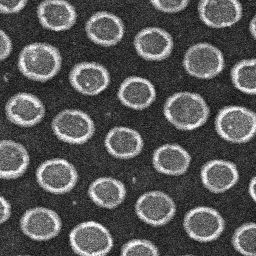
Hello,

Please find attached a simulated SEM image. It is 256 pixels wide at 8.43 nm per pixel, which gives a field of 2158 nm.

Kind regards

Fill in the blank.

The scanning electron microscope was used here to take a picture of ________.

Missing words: a regular array of raised bodies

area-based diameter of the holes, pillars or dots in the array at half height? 0.283 microns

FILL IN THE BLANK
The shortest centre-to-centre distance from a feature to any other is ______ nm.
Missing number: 427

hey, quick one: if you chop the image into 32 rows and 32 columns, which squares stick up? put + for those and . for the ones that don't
+++...++...........++++..+++++..
.....++++................+++++..
.....++++..++++..........+++++..
......++...++++................+
+..........++++..++++...........
+................++++...........
+..++++..........++++...+++.....
...++++................+++++....
...++++..++++..........+++++.+++
....++...++++............+...+++
.........++++..++++..........+++
..........++...++++............+
..+++..........++++..++++.......
.++++................+++++...+..
.++++..++++..........+++++.+++++
..++...++++...........+++..+++++
.......++++...+++..........+++++
........+++..+++++...........++.
++............++++..++..........
+++............+...++++.........
+++...+++..........++++...+++...
++...++++...........+++..++++...
.....++++...++...........+++++..
......+++...+++...........++...+
...........++++...+++...........
+............++..+++++..........
+...++...........+++++..+++.....
...++++...........+++..+++++....
...++++...+++..........+++++..++
....+++..+++++..........+++..+++
.........+++++..+++..........+++
..........+++..++++...........++